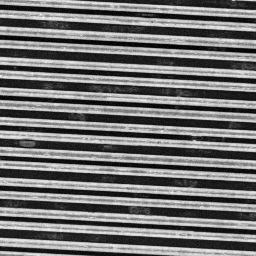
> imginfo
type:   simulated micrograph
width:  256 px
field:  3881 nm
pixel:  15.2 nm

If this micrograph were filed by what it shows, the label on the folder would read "parallel lines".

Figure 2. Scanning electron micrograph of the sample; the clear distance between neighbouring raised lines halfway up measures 123 nm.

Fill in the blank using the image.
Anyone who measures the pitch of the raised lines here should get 228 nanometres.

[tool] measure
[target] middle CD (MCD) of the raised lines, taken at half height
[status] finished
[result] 81.3 nm